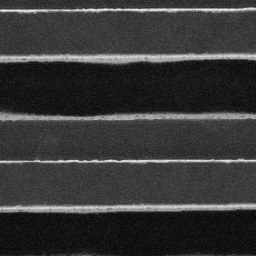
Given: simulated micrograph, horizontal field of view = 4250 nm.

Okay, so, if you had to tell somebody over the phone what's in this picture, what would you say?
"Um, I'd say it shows lines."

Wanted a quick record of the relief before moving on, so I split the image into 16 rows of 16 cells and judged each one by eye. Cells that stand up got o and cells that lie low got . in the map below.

oooooooooooooooo
oooooooooooooooo
oooooooooooooooo
oooooooooooooooo
................
................
................
....oooooooooooo
oooooooooooooooo
oooooooooooooooo
oooooooooooooooo
oooooooooooooooo
oooooooooooooooo
................
................
................